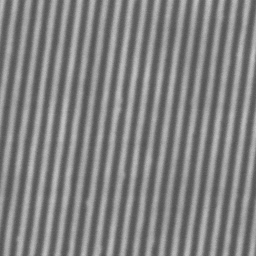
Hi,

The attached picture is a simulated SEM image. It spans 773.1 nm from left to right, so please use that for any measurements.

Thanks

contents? parallel lines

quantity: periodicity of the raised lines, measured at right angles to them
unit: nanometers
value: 38.6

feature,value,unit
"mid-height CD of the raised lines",14.9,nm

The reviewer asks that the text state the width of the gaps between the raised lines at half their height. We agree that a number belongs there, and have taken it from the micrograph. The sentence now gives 23.9 nm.